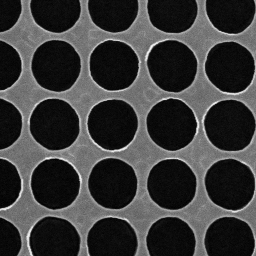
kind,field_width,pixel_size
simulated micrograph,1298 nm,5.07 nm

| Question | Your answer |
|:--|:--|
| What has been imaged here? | a regular array of holes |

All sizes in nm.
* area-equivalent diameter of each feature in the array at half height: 256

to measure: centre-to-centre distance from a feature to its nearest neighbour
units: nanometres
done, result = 293